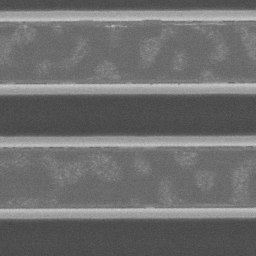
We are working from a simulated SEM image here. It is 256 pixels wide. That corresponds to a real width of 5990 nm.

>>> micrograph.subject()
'one or a few lines or trenches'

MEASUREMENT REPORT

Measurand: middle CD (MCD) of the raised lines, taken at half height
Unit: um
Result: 1.7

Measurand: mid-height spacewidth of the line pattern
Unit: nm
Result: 1230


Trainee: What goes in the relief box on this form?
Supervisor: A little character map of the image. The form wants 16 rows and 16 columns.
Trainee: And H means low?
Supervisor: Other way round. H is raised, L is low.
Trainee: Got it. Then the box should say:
LLLLLLLLLLLLLLLL
HHHHHHHHHHHHHHHH
HHHHHHHHHHHHHHHH
HHHHHHHHHHHHHHHH
HHHHHHHHHHHHHHHH
HHHHHHHHHHHHHHLL
LLLLLLLLLLLLLLLL
LLLLLLLLLLLLLLLL
LLLLLLLLLLLLLLLL
HHHHHHHHHHHHHHHH
HHHHHHHHHHHHHHHH
HHHHHHHHHHHHHHHH
HHHHHHHHHHHHHHHH
LLLLLLLLLLLLLLLL
LLLLLLLLLLLLLLLL
LLLLLLLLLLLLLLLL